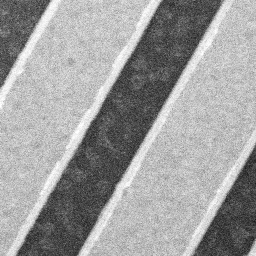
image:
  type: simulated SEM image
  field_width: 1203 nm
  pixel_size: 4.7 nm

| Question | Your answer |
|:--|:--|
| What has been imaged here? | one or a few lines or trenches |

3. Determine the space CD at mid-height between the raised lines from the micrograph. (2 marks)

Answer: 299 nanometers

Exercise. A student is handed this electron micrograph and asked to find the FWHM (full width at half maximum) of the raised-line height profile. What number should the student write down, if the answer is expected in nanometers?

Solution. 418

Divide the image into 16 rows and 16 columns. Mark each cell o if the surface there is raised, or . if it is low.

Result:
...oooooo.....oo
...oooooo.....oo
..oooooo.....ooo
..oooooo....oooo
.oooooo.....oooo
ooooooo....ooooo
oooooo.....ooooo
ooooo.....oooooo
ooooo.....oooooo
oooo.....oooooo.
oooo....ooooooo.
ooo.....oooooo..
ooo....ooooooo..
oo.....oooooo...
o.....oooooo....
o....ooooooo....